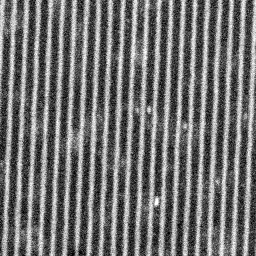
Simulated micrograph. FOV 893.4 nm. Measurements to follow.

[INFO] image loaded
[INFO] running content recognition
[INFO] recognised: parallel lines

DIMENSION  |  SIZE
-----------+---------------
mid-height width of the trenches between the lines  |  8.85 pixels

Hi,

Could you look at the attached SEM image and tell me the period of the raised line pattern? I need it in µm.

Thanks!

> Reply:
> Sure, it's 0.042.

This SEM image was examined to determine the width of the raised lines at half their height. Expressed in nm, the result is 12.2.